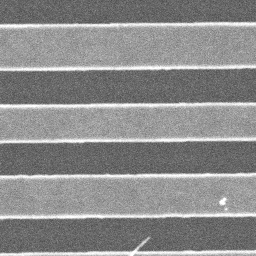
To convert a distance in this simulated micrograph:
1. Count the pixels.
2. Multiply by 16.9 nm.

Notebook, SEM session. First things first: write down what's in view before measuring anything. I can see lines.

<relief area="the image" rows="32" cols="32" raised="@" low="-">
--------------------------------
--------------------------------
--------------------------------
@@@@@@@@@@@@@@@@@@@@@@@@@@@@@@@@
@@@@@@@@@@@@@@@@@@@@@@@@@@@@@@@@
@@@@@@@@@@@@@@@@@@@@@@@@@@@@@@@@
@@@@@@@@@@@@@@@@@@@@@@@@@@@@@@@@
@@@@@@@@@@@@@@@@@@@@@@@@@@@@@@@@
@@@@@@@@@@@@@@@@@@@@@@@@@@@@@---
--------------------------------
--------------------------------
--------------------------------
--------------------------------
@@@@@@@@@@@@@@@@@@@@@@@@@@@@@@@@
@@@@@@@@@@@@@@@@@@@@@@@@@@@@@@@@
@@@@@@@@@@@@@@@@@@@@@@@@@@@@@@@@
@@@@@@@@@@@@@@@@@@@@@@@@@@@@@@@@
@@@@@@@@@@@@@@@@@@@@@@@@@@@@@@@-
--------------------------------
--------------------------------
--------------------------------
--------------------------------
@@@@@@@@@@@@@@@@@@@@@@@@@@@@@@@@
@@@@@@@@@@@@@@@@@@@@@@@@@@@@@@@@
@@@@@@@@@@@@@@@@@@@@@@@@@@@@@@@@
@@@@@@@@@@@@@@@@@@@@@@@@@@@@@@@@
@@@@@@@@@@@@@@@@@@@@@@@@@@@@@@@@
--------------------------------
--------------------------------
--------------------------------
--------------------------------
----------------@@-------@@@@@@@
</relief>